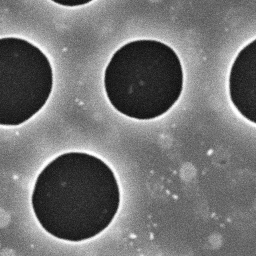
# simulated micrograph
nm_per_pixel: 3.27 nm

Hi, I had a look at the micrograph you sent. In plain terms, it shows holes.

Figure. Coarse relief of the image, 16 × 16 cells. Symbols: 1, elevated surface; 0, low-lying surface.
1111111111111111
1111111111111111
0011111111111111
0001111000011110
0001111000011100
0001111000011100
0001111000011110
0011111111111111
1111111111111111
1111011111111111
1110000111111111
1100000111111111
1100000111111111
1100000111111111
1110001111111111
1111111111111111